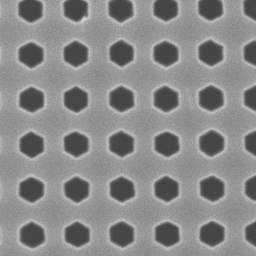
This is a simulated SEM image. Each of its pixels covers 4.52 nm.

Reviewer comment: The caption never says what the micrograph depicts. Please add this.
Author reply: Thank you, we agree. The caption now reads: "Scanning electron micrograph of a regular array of holes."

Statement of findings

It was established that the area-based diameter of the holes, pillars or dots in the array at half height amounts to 109 nm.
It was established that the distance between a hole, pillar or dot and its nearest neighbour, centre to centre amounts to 201 nm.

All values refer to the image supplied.